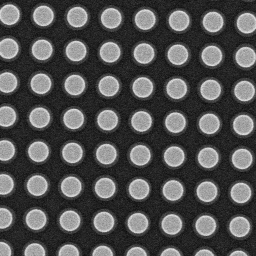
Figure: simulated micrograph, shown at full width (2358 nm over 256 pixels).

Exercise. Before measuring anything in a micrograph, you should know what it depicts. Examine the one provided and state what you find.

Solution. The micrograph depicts an array of small figures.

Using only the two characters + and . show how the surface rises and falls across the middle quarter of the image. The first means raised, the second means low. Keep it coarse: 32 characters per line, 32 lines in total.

...................++......+++..
................................
.+++......++....................
+++++....+++++...+++++....++++..
++++++..++++++...++++++..++++++.
++++++..++++++..+++++++..++++++.
++++++..++++++..+++++++..++++++.
+++++...++++++...++++++..++++++.
..........++......++++....++++..
................................
................................
+++++....++++.....+++......++...
+++++...++++++...+++++....++++..
++++++..++++++..++++++...++++++.
++++++..++++++..++++++...++++++.
+++++...++++++..++++++...++++++.
.+++.....++++....+++++...++++++.
...................+......++++..
................................
++++.....+++....................
+++++...+++++....++++.....+++...
+++++..+++++++..++++++...+++++..
+++++..+++++++..++++++..+++++++.
+++++..+++++++..++++++..+++++++.
++++....+++++...++++++...+++++..
.........+++.....++++....+++++..
................................
................................
++++....++++.....+++.......+....
+++++..++++++...+++++....+++++..
+++++..++++++...++++++..++++++..
+++++..++++++...++++++..++++++..